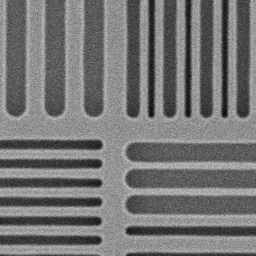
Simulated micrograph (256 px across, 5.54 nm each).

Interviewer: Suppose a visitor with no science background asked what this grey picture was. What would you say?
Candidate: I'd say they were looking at groups of lines, slits or small figures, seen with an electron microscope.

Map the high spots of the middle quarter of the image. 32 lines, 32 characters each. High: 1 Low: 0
01110000001111100001100110001100
01111000001111100001100110001100
01111000001111100001100110001100
01111000001111100001100110001100
11111000001111100001100110001100
11111000001111100001100110001100
11111000001111100001100110001100
11111000001111100001100110001100
11111000001111100001100110001100
11111000001111100001100110001100
11111000001111100001100110001100
11111000001111100001100110001100
11111100001111110001100110001100
11111110111111111011101111011111
11111111111111111111111111111111
11111111111111111111111111111111
11111111111111111111111111111111
11111111111111111111111111111111
11111111111111111111111111111111
00000000001111111100000000111111
00000000001111110000000000000000
00000000011111100000000000000000
11111111111111100000000000000000
11111111111111110000000000000000
00000000001111111000000000000000
00000000001111111111111111111111
11111111111111110000000000000000
11111111111111100000000000000000
00000000011111100000000000000000
00000000001111100000000000000000
00000000011111110000000000000000
11111111111111111111111111111111